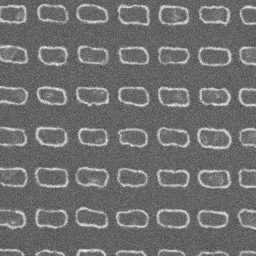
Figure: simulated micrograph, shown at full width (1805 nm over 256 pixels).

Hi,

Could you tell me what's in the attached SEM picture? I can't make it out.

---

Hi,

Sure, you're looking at a regular array of raised bodies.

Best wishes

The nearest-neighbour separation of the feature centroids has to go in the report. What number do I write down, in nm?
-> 281